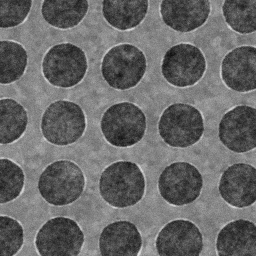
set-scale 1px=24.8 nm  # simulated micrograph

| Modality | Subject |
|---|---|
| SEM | a regular array of holes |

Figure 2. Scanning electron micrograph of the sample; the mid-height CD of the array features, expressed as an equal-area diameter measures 1.14 microns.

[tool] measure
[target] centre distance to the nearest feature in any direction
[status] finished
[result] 1440 nanometers